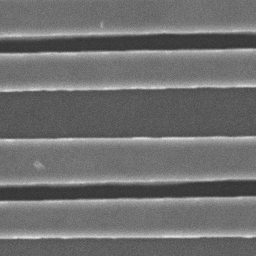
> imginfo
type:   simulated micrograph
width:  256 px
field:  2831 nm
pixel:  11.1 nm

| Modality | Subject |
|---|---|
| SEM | lines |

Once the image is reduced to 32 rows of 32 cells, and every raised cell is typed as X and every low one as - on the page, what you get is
XXXXXXXXXXXXXXXXXXXXXXXXXXXXXXXX
XXXXXXXXXXXXXXXXXXXXXXXXXXXXXXXX
XXXXXXXXXXXXXXXXXXXXXXXXXXXXXXXX
XXXXXXXXXXXXXXXXXXXXXXXXXXXXXXXX
X-------------------------------
--------------------------------
---------------XXXXXXXXXXXXXXXXX
XXXXXXXXXXXXXXXXXXXXXXXXXXXXXXXX
XXXXXXXXXXXXXXXXXXXXXXXXXXXXXXXX
XXXXXXXXXXXXXXXXXXXXXXXXXXXXXXXX
XXXXXXXXXXXXXXXXXXXXXXXXXXXXXXXX
--------------------------------
--------------------------------
--------------------------------
--------------------------------
--------------------------------
--------------------------------
XXXXXXXXXXXXXXXXXXXXXXXXXXXXXXXX
XXXXXXXXXXXXXXXXXXXXXXXXXXXXXXXX
XXXXXXXXXXXXXXXXXXXXXXXXXXXXXXXX
XXXXXXXXXXXXXXXXXXXXXXXXXXXXXXXX
XXXXXXXXXXXXXXXXXXXXXXXXXXXXXXXX
XXXXXXXXXXXXXXXXXXXXXXXXXXX-----
--------------------------------
--------------------------------
XXXXXXXXXXXXXXXXXXXXXXXXXXXXXXXX
XXXXXXXXXXXXXXXXXXXXXXXXXXXXXXXX
XXXXXXXXXXXXXXXXXXXXXXXXXXXXXXXX
XXXXXXXXXXXXXXXXXXXXXXXXXXXXXXXX
XXXXXXXXXXXXXXXXXXXXXXXXXXXXXXXX
--------------------------------
--------------------------------